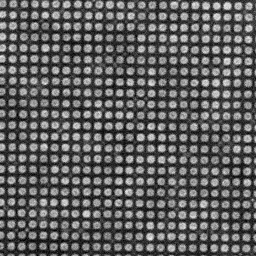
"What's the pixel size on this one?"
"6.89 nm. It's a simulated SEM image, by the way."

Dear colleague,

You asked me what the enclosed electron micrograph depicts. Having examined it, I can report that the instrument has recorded a regular array of raised bodies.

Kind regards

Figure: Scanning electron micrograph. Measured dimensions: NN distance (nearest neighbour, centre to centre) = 72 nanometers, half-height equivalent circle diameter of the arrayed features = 48.6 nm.